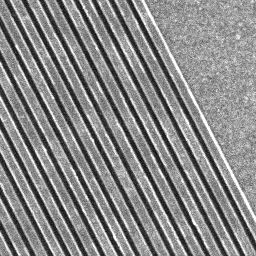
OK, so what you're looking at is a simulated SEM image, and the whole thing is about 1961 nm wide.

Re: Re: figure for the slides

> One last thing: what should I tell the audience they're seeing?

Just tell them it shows parallel lines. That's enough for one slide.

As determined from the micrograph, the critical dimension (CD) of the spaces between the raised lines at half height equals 41.7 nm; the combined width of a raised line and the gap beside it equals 119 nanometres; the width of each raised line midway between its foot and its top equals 10.1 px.